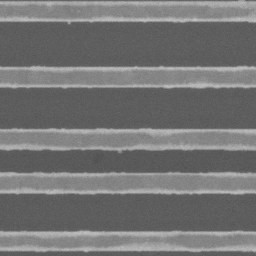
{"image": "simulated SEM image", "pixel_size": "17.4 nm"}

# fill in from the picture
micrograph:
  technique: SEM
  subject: lines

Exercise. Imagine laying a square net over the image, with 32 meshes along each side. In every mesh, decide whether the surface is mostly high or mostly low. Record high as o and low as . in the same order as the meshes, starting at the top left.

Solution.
oooooooooooooooooooooooooooooooo
oooooooooooooooooooooooooooooooo
oooooooooooooooooooooooooooooooo
................................
................................
................................
................................
................................
oooooo...ooo...oooooooooooo..ooo
oooooooooooooooooooooooooooooooo
oooooooooooooooooooooooooooooooo
................................
................................
................................
................................
................................
oooooooooooooooooooooooooooooooo
oooooooooooooooooooooooooooooooo
oooooooooooooooooooooooooooooooo
................................
................................
................................
oooooooooooooooooooooooooooooooo
oooooooooooooooooooooooooooooooo
................................
................................
................................
................................
................................
oooooooooooooooooooooooooooooooo
oooooooooooooooooooooooooooooooo
................................